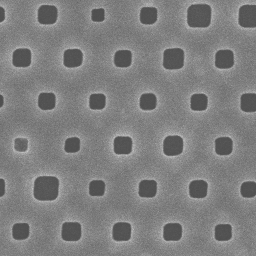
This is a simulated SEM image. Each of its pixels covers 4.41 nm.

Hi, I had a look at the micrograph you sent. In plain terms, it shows a regular array of holes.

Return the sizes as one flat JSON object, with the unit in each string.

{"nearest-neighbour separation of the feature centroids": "0.221 µm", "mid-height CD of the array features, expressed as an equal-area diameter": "84.5 nm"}